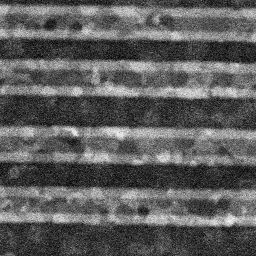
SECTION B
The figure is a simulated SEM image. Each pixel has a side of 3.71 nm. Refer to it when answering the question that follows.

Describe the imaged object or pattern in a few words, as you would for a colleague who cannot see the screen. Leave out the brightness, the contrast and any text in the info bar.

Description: one or a few lines or trenches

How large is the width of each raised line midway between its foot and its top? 96.9 nm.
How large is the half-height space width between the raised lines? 128 nm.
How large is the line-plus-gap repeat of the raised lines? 226 nanometers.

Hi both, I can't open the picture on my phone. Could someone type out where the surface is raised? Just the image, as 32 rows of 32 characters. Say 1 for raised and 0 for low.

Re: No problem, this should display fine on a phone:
00000000000000000000000000000000
11111111111111110000000000000000
11111111111111111111111111111111
11111111111111111111111111111111
00000000000000000000000000011111
00000000000000000000000000000000
00000000000000000000000000000000
00000000000000000000000000000000
11111111111111111111111111111000
11111111111111111111111111111111
11111111111111111111111111111111
00000000000000000001111111111111
00000000000000000000000000000000
00000000000000000000000000000000
00000000000000000000000000000000
00000000000000000000000000000000
11101111000000000000000000000000
11111111111111111111111111111111
11111111111111111111111111111111
11111111111111111111111111111111
00000000000000000000000000000000
00000000000000000000000000000000
00000000000000000000000000000000
00000000000000000000000000000000
11111111111111111111111111111111
11111111111111111111111111111111
11111111111111111111111111111111
00000000000000000000001111111111
00000000000000000000000000000000
00000000000000000000000000000000
00000000000000000000000000000000
00000000000000000000000000000000